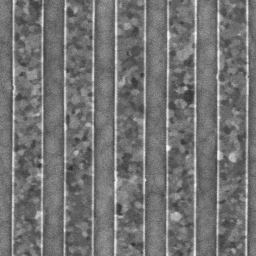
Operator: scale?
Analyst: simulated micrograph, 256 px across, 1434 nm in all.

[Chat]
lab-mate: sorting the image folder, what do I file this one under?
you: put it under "parallel lines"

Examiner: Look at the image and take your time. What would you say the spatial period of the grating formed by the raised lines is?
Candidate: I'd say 287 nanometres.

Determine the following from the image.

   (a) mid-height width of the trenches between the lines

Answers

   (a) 122 nanometers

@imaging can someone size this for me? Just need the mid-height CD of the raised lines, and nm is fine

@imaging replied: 165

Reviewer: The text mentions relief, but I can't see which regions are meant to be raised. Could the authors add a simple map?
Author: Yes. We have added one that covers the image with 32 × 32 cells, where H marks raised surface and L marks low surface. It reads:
LLHHHLLLHHHHLLHHHHLLLHHHLLLHHHHL
LLHHHLLLHHHHLLHHHHLLLHHHLLLHHHHL
LLHHHLLLHHHHLLHHHHLLLHHHLLLHHHHL
LLHHHLLLHHHHLLHHHHLLLHHHLLLHHHHL
LLHHHLLLHHHHLLHHHHLLLHHHLLLHHHHL
LLHHHLLLHHHHLLHHHHLLLHHHLLLHHHHL
LLHHHLLLHHHHLLLHHHLLLHHHLLLHHHHL
LLHHHLLLHHHHLLLHHHLLLHHHLLLHHHHL
LLHHHLLLHHHHLLLHHHLLLHHHLLLHHHHL
LLHHHLLLHHHHLLLHHHLLLHHHLLLHHHHL
LLHHHLLLHHHHLLLHHHLLLHHHLLLHHHHL
LLHHHLLLHHHHLLHHHHLLLHHHLLLHHHHL
LLHHHLLLHHHHLLHHHHLLLHHHLLLHHHHL
LLHHHLLLHHHHLLHHHHLLLHHHLLLHHHHL
LLHHHLLLHHHHLLHHHHLLLHHHLLLHHHHL
LLHHHLLLHHHHLLHHHHLLLHHHLLLHHHHL
LLHHHLLLHHHHLLHHHHLLLHHHLLLHHHHL
LLHHHLLLHHHHLLHHHHLLLHHHLLLHHHHL
LLHHHLLLHHHHLLHHHHLLLHHHLLLHHHHL
LLHHHLLLHHHHLLHHHHLLLHHHLLLHHHHL
LLHHHLLLHHHHLLLHHHLLLHHHLLLHHHHL
LLHHHLLLHHHHLLLHHHLLLHHHLLLHHHHL
LLHHHLLLHHHHLLLHHHLLLHHHLLLHHHHL
LLHHHLLLHHHHLLLHHHLLLHHHLLLHHHHL
LLHHHLLLHHHHLLHHHHLLLHHHLLLHHHHL
LLHHHLLLHHHHLLHHHHLLLHHHLLLHHHHL
LLHHHLLLHHHHLLHHHHLLLHHHLLLHHHHL
LLHHHLLLHHHHLLHHHHLLLHHHLLLHHHHL
LLHHHLLLHHHHLLHHHHLLLHHHLLLHHHHL
LLHHHLLLHHHHLLHHHHLLLHHHLLLHHHHL
LLHHHLLLHHHHLLHHHHLLLHHHLLLHHHHL
LLHHHLLLHHHHLLHHHHLLLHHHLLLHHHHL